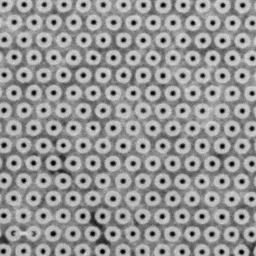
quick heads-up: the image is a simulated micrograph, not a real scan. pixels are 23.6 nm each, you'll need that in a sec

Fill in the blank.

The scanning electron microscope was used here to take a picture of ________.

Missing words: a regular array of ring-shaped raised bodies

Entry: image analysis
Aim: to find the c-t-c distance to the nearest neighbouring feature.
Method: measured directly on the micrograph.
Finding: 0.461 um